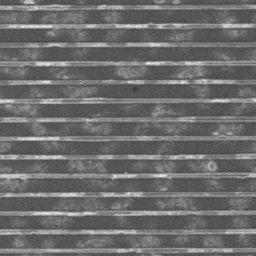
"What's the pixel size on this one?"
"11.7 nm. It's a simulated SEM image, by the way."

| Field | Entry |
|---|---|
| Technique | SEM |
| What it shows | parallel lines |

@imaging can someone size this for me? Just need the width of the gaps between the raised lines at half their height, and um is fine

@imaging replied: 0.183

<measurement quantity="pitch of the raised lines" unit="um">0.218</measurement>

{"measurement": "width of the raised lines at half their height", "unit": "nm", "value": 37.9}